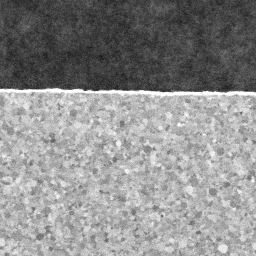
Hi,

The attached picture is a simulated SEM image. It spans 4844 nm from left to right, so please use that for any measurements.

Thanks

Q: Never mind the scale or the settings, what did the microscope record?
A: one or a few lines or trenches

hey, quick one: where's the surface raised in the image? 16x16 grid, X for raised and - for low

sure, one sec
----------------
----------------
----------------
----------------
----------------
----------------
XXXXXXXXXXXXXXXX
XXXXXXXXXXXXXXXX
XXXXXXXXXXXXXXXX
XXXXXXXXXXXXXXXX
XXXXXXXXXXXXXXXX
XXXXXXXXXXXXXXXX
XXXXXXXXXXXXXXXX
XXXXXXXXXXXXXXXX
XXXXXXXXXXXXXXXX
XXXXXXXXXXXXXXXX